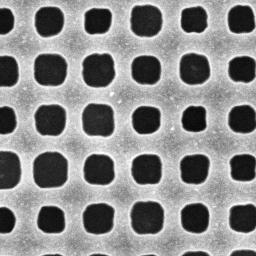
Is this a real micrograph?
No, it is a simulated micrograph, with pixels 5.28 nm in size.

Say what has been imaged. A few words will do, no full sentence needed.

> a regular array of holes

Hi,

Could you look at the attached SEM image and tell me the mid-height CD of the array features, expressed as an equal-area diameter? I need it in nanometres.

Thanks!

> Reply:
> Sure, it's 164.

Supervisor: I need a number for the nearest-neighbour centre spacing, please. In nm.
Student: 252